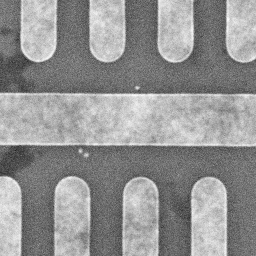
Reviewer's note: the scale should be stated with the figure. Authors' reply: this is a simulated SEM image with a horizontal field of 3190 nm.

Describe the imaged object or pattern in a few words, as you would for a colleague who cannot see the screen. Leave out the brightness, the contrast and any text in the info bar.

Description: groups of lines, slits or small figures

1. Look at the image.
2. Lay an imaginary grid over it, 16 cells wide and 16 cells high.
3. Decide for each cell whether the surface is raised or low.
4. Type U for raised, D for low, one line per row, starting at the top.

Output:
DUUDDDUUDDUUDDUU
DUUDDDUUDDUUDDUU
DUUDDDUUDDUUDDUU
DDUDDDUDDDUUDDDU
DDDDDDDDDDDDDDDD
DDDDDDDDDDDDDDDD
UUUUUUUUUUUUUUUU
UUUUUUUUUUUUUUUU
UUUUUUUUUUUUUUUU
DDDDDDDDDDDDDDDD
DDDDDDDDDDDDDDDD
UDDDUDDDUUDDUUDD
UDDUUUDDUUDDUUDD
UDDUUUDDUUDDUUDD
UDDUUUDDUUDDUUDD
UDDUUUDDUUDDUUDD